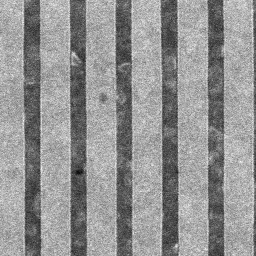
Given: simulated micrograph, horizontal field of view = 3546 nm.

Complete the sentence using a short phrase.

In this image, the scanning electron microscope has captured parallel lines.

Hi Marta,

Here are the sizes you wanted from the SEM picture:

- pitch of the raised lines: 634 nm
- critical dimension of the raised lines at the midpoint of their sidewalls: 0.396 um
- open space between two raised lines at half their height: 235 nm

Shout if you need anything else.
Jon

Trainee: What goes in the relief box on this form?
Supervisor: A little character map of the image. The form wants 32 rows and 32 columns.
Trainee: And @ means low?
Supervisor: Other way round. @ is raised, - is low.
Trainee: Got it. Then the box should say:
@@@--@@@@--@@@---@@@--@@@@--@@@-
@@@--@@@@--@@@---@@@--@@@@--@@@@
@@@--@@@@--@@@---@@@--@@@@--@@@@
@@@--@@@@--@@@---@@@--@@@@--@@@@
@@@--@@@@--@@@---@@@--@@@@--@@@@
@@@--@@@@--@@@---@@@--@@@@--@@@@
@@@--@@@@--@@@---@@@--@@@@--@@@@
@@@--@@@@@-@@@--@@@@-@@@@@--@@@@
@@@--@@@@--@@@-@@@@@--@@@@--@@@@
@@@--@@@@--@@@---@@@--@@@@--@@@@
@@@--@@@@--@@@---@@@--@@@@--@@@@
@@@--@@@@--@@@---@@@--@@@@--@@@@
@@@--@@@@--@@@---@@@--@@@@--@@@@
@@@--@@@@--@@@---@@@--@@@@--@@@@
@@@--@@@@--@@@---@@@--@@@@--@@@@
@@@--@@@@--@@@---@@@--@@@@--@@@@
@@@--@@@@--@@@---@@@--@@@@--@@@@
@@@--@@@@--@@@---@@@--@@@@--@@@@
@@@--@@@@--@@@---@@@--@@@@--@@@@
@@@--@@@@--@@@---@@@--@@@@--@@@@
@@@--@@@@--@@@---@@@--@@@@--@@@@
@@@--@@@@--@@@---@@@--@@@@--@@@@
@@@--@@@@--@@@---@@@--@@@@--@@@@
@@@--@@@@--@@@---@@@--@@@@--@@@@
@@@--@@@@--@@@---@@@--@@@@--@@@@
@@@--@@@@--@@@---@@@--@@@@--@@@@
@@@--@@@@--@@@---@@@--@@@@--@@@@
@@@--@@@@--@@@---@@@--@@@@--@@@@
@@@--@@@@--@@@---@@@--@@@@--@@@@
@@@--@@@@--@@@---@@@--@@@@--@@@@
@@@--@@@@--@@@---@@@--@@@@--@@@@
@@@--@@@@--@@@---@@@--@@@@--@@@@